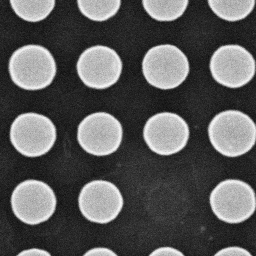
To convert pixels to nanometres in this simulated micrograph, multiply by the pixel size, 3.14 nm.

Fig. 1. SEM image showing a regular array of raised bodies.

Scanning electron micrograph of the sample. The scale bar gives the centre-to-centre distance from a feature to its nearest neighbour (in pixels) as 67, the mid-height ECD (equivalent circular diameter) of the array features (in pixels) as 43.1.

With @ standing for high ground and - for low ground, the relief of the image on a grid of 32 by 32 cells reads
-@@@@@@---@@@@@---@@@@@---@@@@@@
--@@@@----@@@@-----@@@@----@@@@-
---@@-------@---------------@@--
--------------------------------
--------------------------------
--------------------------------
--@@@@-----@@@-----@@@@----@@@@-
-@@@@@@---@@@@@---@@@@@---@@@@@@
-@@@@@@---@@@@@---@@@@@---@@@@@@
-@@@@@@---@@@@@---@@@@@----@@@@@
--@@@@-----@@@-----@@@------@@--
--------------------------------
--------------------------------
--------------------------------
---@@------@@@-----@@@-----@@@@-
--@@@@----@@@@@---@@@@@---@@@@@@
-@@@@@@---@@@@@---@@@@@---@@@@@@
-@@@@@@---@@@@@---@@@@@---@@@@@@
--@@@@----@@@@@----@@@@----@@@@-
--------------------------------
--------------------------------
--------------------------------
--------------------------------
--@@@@-----@@@-------------@@@@-
--@@@@@---@@@@@-----------@@@@@@
-@@@@@@---@@@@@-----------@@@@@@
--@@@@@---@@@@@------------@@@@@
---@@------@@@--------------@@--
--------------------------------
--------------------------------
--------------------------------
---@@@-----@@@-----@@@-----@@@@-